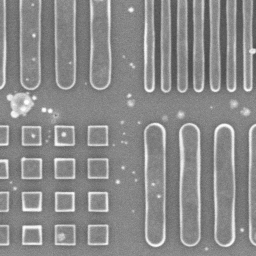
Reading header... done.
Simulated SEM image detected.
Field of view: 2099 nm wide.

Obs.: groups of lines, slits or small figures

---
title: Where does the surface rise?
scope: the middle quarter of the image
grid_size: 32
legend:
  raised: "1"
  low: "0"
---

11100001111100000000110001000110
11100001111100000000110001000110
11100001111100000000110001000110
11100001111000000000110001100110
11100001111000000000110001100110
11000001111000000000110001100110
00000000000000000000010001000100
00000000000000000000000000000000
00000000000000000000000000000000
00000000000000000000000000000000
00000000000000000000000000000000
00000000000000000000000000000000
00000000000000000000000000000000
00000000000000000000000000000000
00000000000000000000000000000000
00000000000000000000011100000011
11000011111000000000111110000111
11000011111000000000111110000111
11000011111000000000111110000111
11000011111000000000111110000111
00000000000000000000011110000111
00000000000000000000011110000111
00000000000000000000011110000111
00000000000000000000011110000011
11000011111000000000011110000111
11000011111000000000011110000111
11000011111000000000011110000111
11000011111000000000011110000111
11000000001000000000011110000111
00000000000000000000011110000111
00000000000000000000011110000111
00000000000000000000011110000111